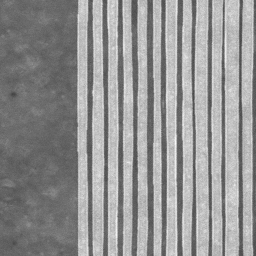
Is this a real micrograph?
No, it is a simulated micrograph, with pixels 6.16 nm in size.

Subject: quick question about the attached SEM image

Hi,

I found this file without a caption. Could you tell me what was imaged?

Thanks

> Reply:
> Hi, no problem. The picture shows parallel lines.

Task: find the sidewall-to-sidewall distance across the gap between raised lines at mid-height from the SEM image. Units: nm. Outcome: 33.1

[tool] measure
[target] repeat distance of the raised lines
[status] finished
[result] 0.0926 µm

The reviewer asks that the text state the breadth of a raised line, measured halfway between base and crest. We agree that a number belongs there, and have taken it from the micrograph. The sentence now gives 54.7 nanometers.